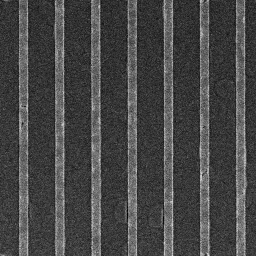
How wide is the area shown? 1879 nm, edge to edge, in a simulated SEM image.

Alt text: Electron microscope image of parallel lines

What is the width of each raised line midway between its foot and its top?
0.0615 um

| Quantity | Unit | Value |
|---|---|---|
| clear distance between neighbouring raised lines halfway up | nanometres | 204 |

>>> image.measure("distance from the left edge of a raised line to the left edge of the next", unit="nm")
266